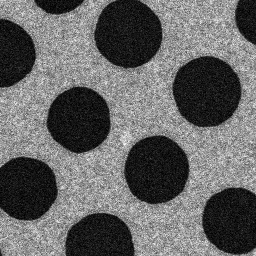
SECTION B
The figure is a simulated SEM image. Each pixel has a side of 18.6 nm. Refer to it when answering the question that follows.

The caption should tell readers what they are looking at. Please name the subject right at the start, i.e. holes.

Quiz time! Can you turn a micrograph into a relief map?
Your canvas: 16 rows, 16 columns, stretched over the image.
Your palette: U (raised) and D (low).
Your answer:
UUUDDUUDDUUUUUUD
DUUUUUDDDDUUUUUD
DDUUUUDDDDUUUUUD
DDUUUUDDDDUUUUUU
DDUUUUUUUUUDDDDU
UUUUDDUUUUUDDDDU
UUUDDDDUUUUDDDDU
UUUDDDDUUUUUDDUU
UUUDDDDUUUUUUUUU
UUUUUUUUDDDUUUUU
DDDUUUUUDDDDUUUU
DDDDUUUUDDDDUUUU
DDDUUUUUUDDUUDDD
UDDUUDDUUUUUUDDD
UUUUDDDDUUUUUDDD
UUUUDDDDUUUUUUDD